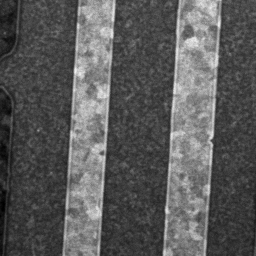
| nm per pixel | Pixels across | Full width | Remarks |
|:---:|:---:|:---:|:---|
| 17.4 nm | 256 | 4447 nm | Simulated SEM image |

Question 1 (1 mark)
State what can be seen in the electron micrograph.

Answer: one or a few lines or trenches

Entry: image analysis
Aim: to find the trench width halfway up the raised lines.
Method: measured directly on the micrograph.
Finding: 1120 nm